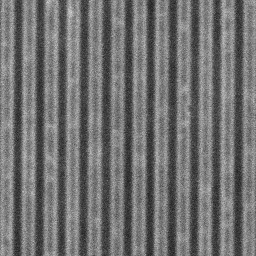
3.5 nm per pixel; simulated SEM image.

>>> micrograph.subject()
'parallel lines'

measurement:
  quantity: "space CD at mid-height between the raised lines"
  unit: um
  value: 0.0371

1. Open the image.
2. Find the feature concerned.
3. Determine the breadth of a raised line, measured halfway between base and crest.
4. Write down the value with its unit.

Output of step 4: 40.6 nm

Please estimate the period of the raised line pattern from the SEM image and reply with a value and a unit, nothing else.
77.1 nanometers